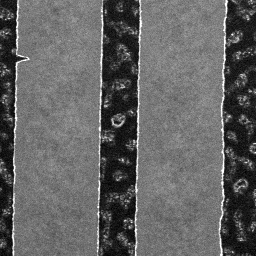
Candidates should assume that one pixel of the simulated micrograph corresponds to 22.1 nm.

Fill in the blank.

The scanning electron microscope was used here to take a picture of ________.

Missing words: one or a few lines or trenches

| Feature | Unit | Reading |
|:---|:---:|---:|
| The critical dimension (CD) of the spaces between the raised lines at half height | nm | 1880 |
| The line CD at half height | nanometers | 832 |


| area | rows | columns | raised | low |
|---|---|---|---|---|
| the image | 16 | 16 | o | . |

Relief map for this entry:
o.....ooo.....oo
o.....ooo.....oo
o.....ooo.....oo
o.....ooo.....oo
o.....ooo.....oo
o.....ooo.....oo
o.....ooo.....oo
o.....ooo.....oo
o.....ooo.....oo
o.....ooo.....oo
o.....ooo.....oo
o.....ooo.....oo
o.....ooo.....oo
o.....oo......oo
o.....ooo.....oo
o.....oo......oo